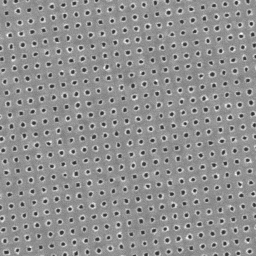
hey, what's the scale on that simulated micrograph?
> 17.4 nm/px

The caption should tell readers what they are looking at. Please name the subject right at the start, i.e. a regular array of holes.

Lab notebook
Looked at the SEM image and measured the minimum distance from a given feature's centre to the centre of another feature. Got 190 nm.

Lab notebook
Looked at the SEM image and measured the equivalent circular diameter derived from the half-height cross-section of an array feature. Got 0.0735 micrometres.